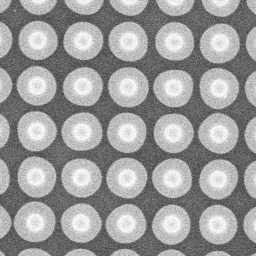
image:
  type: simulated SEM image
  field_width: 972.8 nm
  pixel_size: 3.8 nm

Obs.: an array of small figures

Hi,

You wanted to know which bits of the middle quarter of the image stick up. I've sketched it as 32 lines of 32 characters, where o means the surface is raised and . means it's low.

................................
...ooooo......oooo..............
.oooooooo...oooooooo....ooooooo.
.oooooooo...ooooooooo..ooooooooo
oooooooooo.oooooooooo..ooooooooo
oooooooooo.oooooooooo.oooooooooo
oooooooooo.oooooooooo.oooooooooo
ooooooooo...ooooooooo..ooooooooo
.oooooooo...oooooooo...oooooooo.
..oooooo.....ooooooo....ooooooo.
..............oooo........ooo...
................................
...oooo.......ooo...............
.ooooooo....ooooooo.....ooooooo.
ooooooooo...oooooooo...oooooooo.
ooooooooo..ooooooooo...ooooooooo
ooooooooo..ooooooooo...ooooooooo
ooooooooo..ooooooooo...ooooooooo
ooooooooo..ooooooooo...ooooooooo
ooooooooo..ooooooooo...ooooooooo
.ooooooo....ooooooo.....ooooooo.
...ooo.......ooooo.......ooooo..
................................
................................
.oooooo......oooooo......ooooo..
oooooooo....oooooooo...oooooooo.
ooooooooo..ooooooooo...oooooooo.
ooooooooo..oooooooooo.oooooooooo
ooooooooo..oooooooooo.oooooooooo
ooooooooo..oooooooooo.oooooooooo
ooooooooo..ooooooooo...ooooooooo
.ooooooo....oooooooo...oooooooo.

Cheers